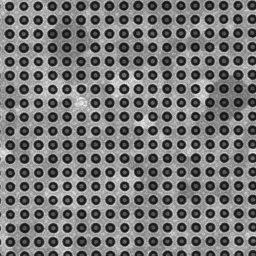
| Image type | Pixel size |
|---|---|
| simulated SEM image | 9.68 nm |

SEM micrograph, a regular array of ring-shaped grooves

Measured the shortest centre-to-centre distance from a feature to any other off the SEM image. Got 133 nm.